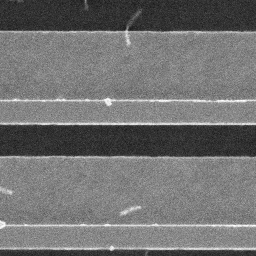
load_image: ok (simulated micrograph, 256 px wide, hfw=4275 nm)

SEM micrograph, lines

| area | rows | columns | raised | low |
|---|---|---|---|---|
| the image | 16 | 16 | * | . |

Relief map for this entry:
................
................
****************
****************
****************
****************
****************
****************
................
................
****************
****************
****************
****************
****************
****************